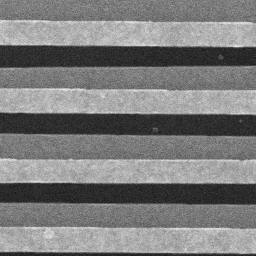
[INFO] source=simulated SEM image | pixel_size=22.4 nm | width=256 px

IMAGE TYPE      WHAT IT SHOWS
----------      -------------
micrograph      lines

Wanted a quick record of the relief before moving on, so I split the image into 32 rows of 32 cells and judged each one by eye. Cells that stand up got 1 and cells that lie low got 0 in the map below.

11111111111111111111111111111111
11111111111111111111111111111111
11111111111111111111111111111111
11111111111111111111111111111111
11111111111111111111111111111111
11111111111111111111111111111111
00000000000000000000000000000000
00000000000000000000000000000000
00000000000000011111111111111111
11111111111111111111111111111111
11111111111111111111111111111111
11111111111111111111111111111111
11111111111111111111111111111111
11111111111111111111111111111111
00000000000000000000000000000000
00000000000000000000000000000000
00000000000000000000000000000000
11111111111111111111111111111111
11111111111111111111111111111111
11111111111111111111111111111111
11111111111111111111111111111111
11111111111111111111111111111111
11111111111111111111111111111111
00000000000000000000000000000000
00000000000000000000000000000000
00000000000000000000000000000000
11111111111111111111111111111111
11111111111111111111111111111111
11111111111111111111111111111111
11111111111111111111111111111111
11111111111111111111111111111111
00000000000000111111111111111111